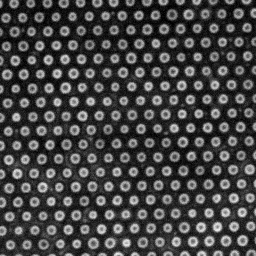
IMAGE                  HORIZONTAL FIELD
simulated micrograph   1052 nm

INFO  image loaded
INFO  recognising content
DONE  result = a regular array of raised bodies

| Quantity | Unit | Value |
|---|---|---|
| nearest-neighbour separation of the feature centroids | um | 0.0661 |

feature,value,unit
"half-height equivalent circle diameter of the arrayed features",8.37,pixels